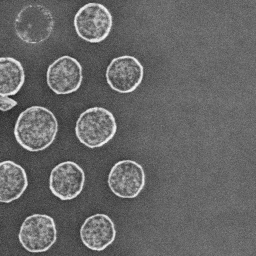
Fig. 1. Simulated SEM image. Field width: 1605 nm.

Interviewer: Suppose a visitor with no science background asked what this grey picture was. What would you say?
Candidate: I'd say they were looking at a regular array of raised bodies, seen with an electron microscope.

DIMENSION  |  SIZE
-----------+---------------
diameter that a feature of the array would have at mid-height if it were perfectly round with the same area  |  0.224 micrometres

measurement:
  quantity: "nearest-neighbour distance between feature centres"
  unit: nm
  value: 376